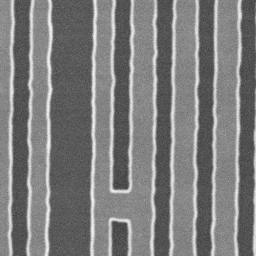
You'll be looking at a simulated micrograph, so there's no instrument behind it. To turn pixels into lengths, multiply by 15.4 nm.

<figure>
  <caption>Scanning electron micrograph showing groups of lines, slits or small figures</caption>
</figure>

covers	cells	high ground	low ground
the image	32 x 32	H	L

HHLLHHLLLLLLHHLLLHHLLLHHHLLHHHLL
HHLLHHLLLLLLHHLLLHHLLLHHHLLHHHLL
HHLLHHLLLLLLHHLLLHHLLLHHHLLHHHLL
HHLLHHLLLLLLHHLLLHHLLLHHHLLHHHLL
HHLLHHLLLLLLHHLLLHHLLLHHHLLHHHLL
HLLLHHLLLLLLHHLLHHHLLLHHHLLHHHLL
HLLLHHLLLLLLHHLLLHHLLLHHHLLHHHLL
HHLLHHLLLLLLHHLLHHHLLLHHHLLHHHLL
HHLLHHLLLLLLHHLLHHHLLLHHHLLHHHLL
HHLLHHLLLLLLHHLLHHHLLLHHHLLHHHLL
HLLLHHLLLLLLHHLLHHHLLLHHHLLHHHLL
HLLLHHLLLLLLHHLLHHHLLLHHLLLHHHLL
HLLLHHLLLLLLHHLLHHHLLLHHHLLHHHLL
HLLLHHLLLLLLHHLLHHHLLLHHHLLHHHLL
HLLLHHLLLLLLHHLLHHHLLLHHHLLHHHLL
HLLLHHLLLLLLHHLLHHHLLLHHHLLHHHLL
HLLLHHLLLLLLHHLLHHHLLLHHHLLHHHLL
HLLLHHLLLLLLHHLLHHHLLLHHLLLHHHLL
HLLLHHLLLLLLHHLLHHHLLLHHLLLHHHLL
HLLLHHLLLLLLHHLLHHHLLLHHLLLHHHLL
HLLLHHLLLLLLHHLLHHHLLLHHLLLHHHLL
HLLLHHLLLLLLHHLLHHHLLLHHLLLHHHLL
HLLLHHLLLLLLHHLLHHHLLLHHLLLHHHLL
HLLLHHLLLLLHHHLLHHHLLLHHLLLHHHLL
HLLLHHLLLLLHHHHHHHHLLHHHLLLHHHLL
HLLLHHLLLLLLHHHHHHHLLHHHLLLHHHLL
HLLLHHLLLLLLHHHHHHHLLHHHLLLHHHLL
HLLLHHLLLLLLHHHHHHHLLHHHLLLHHHLL
HLLLHHLLLLLLHHLLHHHLLHHHLLLHHLLL
HLLLHHLLLLLLHHLLHHHLLHHHLLLHHLLL
HLLLHHLLLLLHHHLLHHHLLHHHLLLHHLLL
HLLLHHLLLLLHHHLLHHHLLHHHLLLHHHLL